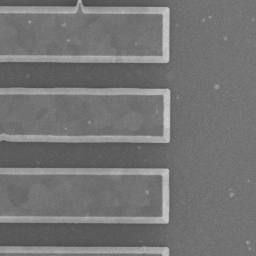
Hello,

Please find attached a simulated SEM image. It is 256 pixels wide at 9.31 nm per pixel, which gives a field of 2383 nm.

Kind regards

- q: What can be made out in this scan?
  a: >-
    one or a few lines or trenches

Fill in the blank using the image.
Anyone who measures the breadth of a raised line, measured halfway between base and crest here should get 0.459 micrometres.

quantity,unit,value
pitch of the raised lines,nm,750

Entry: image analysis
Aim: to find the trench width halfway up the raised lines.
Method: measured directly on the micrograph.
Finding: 294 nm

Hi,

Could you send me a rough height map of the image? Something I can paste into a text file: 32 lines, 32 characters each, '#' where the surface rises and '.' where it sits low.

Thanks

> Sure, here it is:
................................
#####################...........
#####################...........
#####################...........
#####################...........
#####################...........
#####################...........
................................
................................
................................
................................
#####################...........
#####################...........
#####################...........
#####################...........
#####################...........
#####################...........
................................
................................
................................
................................
####################............
#####################...........
#####################...........
#####################...........
#####################...........
#####################...........
................####............
................................
................................
................................
####################............